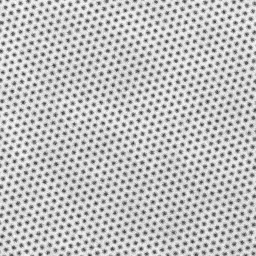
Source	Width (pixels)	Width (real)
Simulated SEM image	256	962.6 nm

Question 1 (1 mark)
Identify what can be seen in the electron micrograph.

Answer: a regular array of holes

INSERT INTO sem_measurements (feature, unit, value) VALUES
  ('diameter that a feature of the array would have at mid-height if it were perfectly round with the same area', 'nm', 17.5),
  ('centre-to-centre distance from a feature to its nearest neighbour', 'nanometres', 28.6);